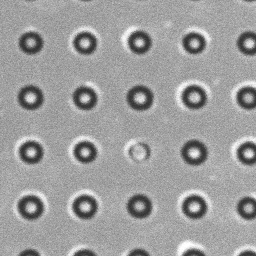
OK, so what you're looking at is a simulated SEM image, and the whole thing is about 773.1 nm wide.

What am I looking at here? a regular array of ring-shaped grooves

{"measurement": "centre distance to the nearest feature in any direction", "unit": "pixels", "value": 54.3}